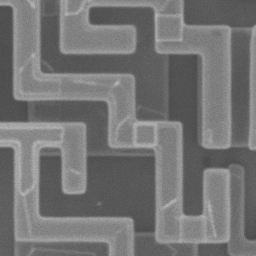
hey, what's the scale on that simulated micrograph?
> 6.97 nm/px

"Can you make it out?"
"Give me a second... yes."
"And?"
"wiring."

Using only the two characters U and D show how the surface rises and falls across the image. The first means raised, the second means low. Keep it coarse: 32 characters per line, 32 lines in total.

UUUUUDDDUUUUUUUUUUUUUUUDDDDDDDDD
DDUUUDDDUUUDDDDDDDDUUUUDDDDDDDDD
DDUUUDDDUUUDDDDDDDDUUUUDDDDDDDDD
DDUUUDDDUUUUUUUUUDDUUUUUUUUUUDDD
DDUUUDDDUUUUUUUUUDDUUUUUUUUUUDDU
DDUUUDDDUUUUUUUUUDDUUUUUUUUUUDDU
DDUUUDDDUUUUUUUUUDDDUUUUUUUUUDDU
DDUUUDDDDDDDDDDDDDDDDDDDDUUUUDDU
DDUUUDDDDDDDDDDDDDDDDDDDDUUUUDDU
DDUUUUUUUUUUUUUUUDDDDDDDDUUUUDDU
DDUUUUUUUUUUUUUUUDDDDDDDDUUUUDDU
DDUUUUUUUUUUUUUUUDDDDDDDDUUUUDDU
DDDDDDDDDDDDDUUUUDDDDDDDDUUUUDDU
DDDDDDDDDDDDDDUUUDDDDDDDDUUUUDDU
DDDDDDDDDDDDDDUUUDDDDDDDDUUUUDDU
UUUUUUUUUUDDDDUUUUUUUUUDDUUUUDDU
UUUUUUUUUUUDDDUUUUUUUUUDDUUUUDDU
UUUUUUUUUUUDDDUUUUUUUUUDDUUUUDDU
DUUUUDDUUUUDDDDDDDDUUUUDDDDDDDDU
DDUUUDDDUUUDDDDDDDDDUUUDDDDDDDDD
DDUUUDDDUUUDDDDDDDDDUUUDDDDDDDDD
DDUUUDDDUUUDDDDDDDDDUUUDDDUUUDDD
DDUUUDDDUUUDDDDDDDDDUUUDDDUUUDDD
DDUUUDDDUUUDDDDDDDDDUUUDDDUUUDDD
DDUUUDDDDDDDDDDDDDDDUUUDDUUUUDDD
DDUUUDDDDDDDDDDDDDDDUUUDDDUUUDDD
DDUUUDDDDDDDDDDDDDDDUUUDDUUUUDDD
DDUUUUUUUUUUUUUUDDDDUUUUUUUUUDDD
DDUUUUUUUUUUUUUUUDDDUUUUUUUUUDDD
DDUUUUUUUUUUUUUUUDDDUUUUUUUUUDDD
DDDDDDDDDDDDDUUUUDDDDDDDDDDDDDDD
DDDDDDDDDDDDDDUUUDDDDDDDDDDDDDDD